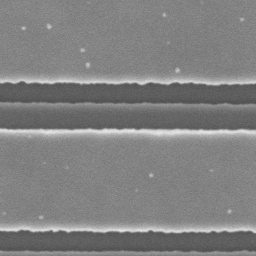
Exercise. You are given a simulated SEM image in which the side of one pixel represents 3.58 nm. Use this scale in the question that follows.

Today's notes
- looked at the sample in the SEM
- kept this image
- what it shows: lines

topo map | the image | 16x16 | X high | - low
XXXXXXXXXXXXXXXX
XXXXXXXXXXXXXXXX
XXXXXXXXXXXXXXXX
XXXXXXXXXXXXXXXX
XXXXXXXXXXXXXXXX
----------------
----------------
----------------
XXXXXXXXXXXXXXXX
XXXXXXXXXXXXXXXX
XXXXXXXXXXXXXXXX
XXXXXXXXXXXXXXXX
XXXXXXXXXXXXXXXX
XXXXXXXXXXXXXXXX
----------XX----
----------------